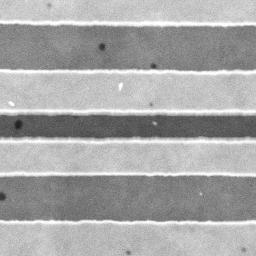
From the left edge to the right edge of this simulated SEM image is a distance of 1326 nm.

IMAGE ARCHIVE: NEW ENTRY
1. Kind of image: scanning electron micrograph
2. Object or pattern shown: lines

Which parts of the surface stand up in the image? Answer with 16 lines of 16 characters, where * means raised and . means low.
****************
.......*********
................
................
***********...**
****************
****************
................
................
****************
****************
................
................
................
****************
****************